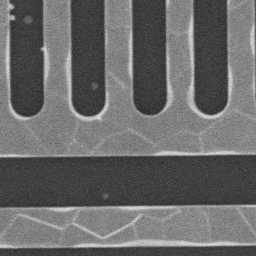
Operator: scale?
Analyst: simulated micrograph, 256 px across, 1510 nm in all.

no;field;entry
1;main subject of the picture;groups of lines, slits or small figures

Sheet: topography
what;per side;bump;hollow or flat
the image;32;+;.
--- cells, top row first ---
+....++++....+++.....+++.....+++
+....++++....+++.....+++.....+++
+....++++....+++.....+++.....+++
+....++++....+++.....+++.....+++
+.....+++....+++.....+++.....++.
+.....+++....+++.....+++.....+++
+.....+++....+++.....+++.....+++
+.....+++....+++.....+++.....+++
+.....+++....+++.....+++.....+++
+.....+++....+++.....+++.....+++
+.....+++....++++....+++.....+++
+.....+++....++++....+++.....+++
+.....+++....++++....+++.....+++
+....++++....++++....+++....++++
++..++++++..++++++++++++++.+++++
++++++++++++++++++++++++++++++++
++++++++++++++++++++++++++++++++
++++++++++++++++++++++++++++++++
++++++++++++++++++++++++++++++++
................................
................................
................................
................................
................................
................................
................................
++++++++++++++++++++++++++++++++
++++++++++++++++++++++++++++++++
++++++++++++++++++++++++++++++++
++++++++++++++++++++++++++++++++
+++++++++++++++++......++++..+++
................................